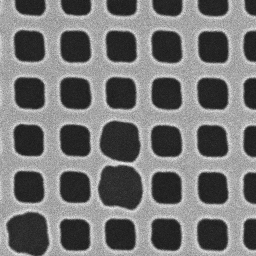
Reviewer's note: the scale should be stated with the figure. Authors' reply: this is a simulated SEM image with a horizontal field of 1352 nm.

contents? a regular array of holes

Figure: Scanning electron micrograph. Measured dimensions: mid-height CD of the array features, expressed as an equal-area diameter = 176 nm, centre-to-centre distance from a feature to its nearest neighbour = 0.242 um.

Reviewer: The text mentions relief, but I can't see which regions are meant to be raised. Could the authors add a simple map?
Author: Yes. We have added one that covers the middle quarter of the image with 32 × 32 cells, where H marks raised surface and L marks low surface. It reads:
HHHHHHHHHHHHHHHHHHHHHHHHHHHHHHHH
HHHHHHHHHHHHHHHHHHHHHHHHHHHHHHHH
HHHHHHHHHHHHHHHHHHHHHHHHHHHHHHHH
LLLLLHHHHHHHLLLLHHHHHHHHLLLHHHHH
LLLLLLHHHHHLLLLLLLHHHHLLLLLLLHHH
LLLLLLLHHHLLLLLLLLHHHHLLLLLLLHHH
LLLLLLLHHHLLLLLLLLHHHHLLLLLLLHHH
LLLLLLLHHHLLLLLLLLHHHHLLLLLLLHHH
LLLLLLLHHHLLLLLLLLHHHHLLLLLLLLHH
LLLLLLLHHHHLLLLLLLHHHHLLLLLLLLHH
LLLLLLHHHHHLLLLLLLHHHHHLLLLLLHHH
HHHHHHHHHHHHHHHHHHHHHHHHHHHHHHHH
HHHHHHHHHHHHHHHHHHHHHHHHHHHHHHHH
HHHHHHHHHHHHHHHHHHHHHHHHHHHHHHHH
HHHHHHHHHHHLLLLHHHHHHHHHHHHHHHHH
LLLLLHHHHHLLLLLLLLHHHHHLLLHHHHHH
LLLLLLHHHLLLLLLLLLLHHHLLLLLLLHHH
LLLLLLLHHLLLLLLLLLLHHHLLLLLLLHHH
LLLLLLLHHLLLLLLLLLLHHHLLLLLLLHHH
LLLLLLLHHLLLLLLLLLLHHHLLLLLLLLHH
LLLLLLLHHLLLLLLLLLLHHHLLLLLLLLHH
LLLLLLLHHLLLLLLLLLLHHHLLLLLLLLHH
LLLLLLHHHHLLLLLLLLLHHHHLLLLLLHHH
HHHHHHHHHHHLLLLLLLHHHHHHHHHHHHHH
HHHHHHHHHHHHHHHLLHHHHHHHHHHHHHHH
HHHHHHHHHHHLLLLLHHHHHHHHHHHHHHHH
HHHHHHHHHHLLLLLLLLHHHHHHHHHHHHHH
LLLLLLHHHLLLLLLLLLLHHHHLLLLLHHHH
LLLLLLHHHLLLLLLLLLLHHHLLLLLLLHHH
LLLLLLHHHLLLLLLLLLLLHHLLLLLLLHHH
LLLLLLLHHLLLLLLLLLLLHHLLLLLLLHHH
LLLLLLLHHLLLLLLLLLLLHHLLLLLLLHHH